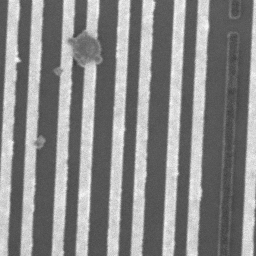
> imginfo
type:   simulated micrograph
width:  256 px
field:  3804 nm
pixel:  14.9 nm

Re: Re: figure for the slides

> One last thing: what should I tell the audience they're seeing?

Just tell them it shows parallel lines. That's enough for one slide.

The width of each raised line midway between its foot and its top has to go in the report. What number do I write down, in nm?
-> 152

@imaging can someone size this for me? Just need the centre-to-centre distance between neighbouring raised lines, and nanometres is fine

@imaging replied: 411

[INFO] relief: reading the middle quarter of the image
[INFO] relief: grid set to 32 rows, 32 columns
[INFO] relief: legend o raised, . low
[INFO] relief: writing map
oo..oooo.....oo....oo......oo...
oo...ooo.....oo....ooo.....oo...
oo...ooo.....oo....ooo.....oo...
oo...ooo.....oo....oo......oo...
oo...ooo.....oo....oo......oo...
oo...ooo.....oo....oo......oo...
oo...ooo.....oo....oo......oo...
oo...ooo.....oo....oo......oo...
o....ooo.....oo....oo......oo...
o....oo......oo....oo......oo...
o....oo......oo....oo......oo...
o....oo......oo....oo......oo...
o....oo......oo....oo......oo...
o....oo......oo...ooo......oo...
o....oo......oo...ooo.....ooo...
o....oo......oo....oo.....ooo...
o....oo.....ooo...ooo.....ooo...
o....oo.....ooo...ooo.....ooo...
o....oo.....ooo...ooo.....ooo...
o...ooo.....ooo...ooo.....oo....
o...ooo.....ooo...oo......oo....
o...ooo.....ooo...oo......oo....
o...ooo.....oo....oo......oo....
o...ooo.....oo....oo......oo....
o...ooo.....oo....oo......oo....
o...ooo.....oo....oo......oo....
o...ooo.....oo....oo......oo....
o...ooo.....oo....oo......ooo...
o...ooo.....oo....oo......oo....
o...oo......oo....oo......oo....
o...oo......oo....oo......oo....
....oo......oo....oo......oo...o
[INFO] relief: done